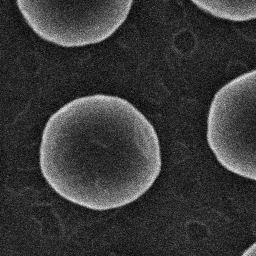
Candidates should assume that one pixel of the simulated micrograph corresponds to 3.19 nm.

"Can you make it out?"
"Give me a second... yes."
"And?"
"raised bodies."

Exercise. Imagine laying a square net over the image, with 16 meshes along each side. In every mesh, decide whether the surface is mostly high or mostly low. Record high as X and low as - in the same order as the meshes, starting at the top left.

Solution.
-XXXXXXX-----XXX
--XXXXXX--------
---XXX----------
----------------
----------------
--------------XX
----XXXX-----XXX
---XXXXXX----XXX
---XXXXXXX---XXX
---XXXXXXX---XXX
---XXXXXXX----XX
---XXXXXX-------
----XXXX--------
----------------
----------------
----------------